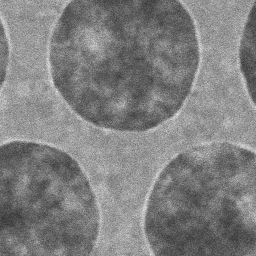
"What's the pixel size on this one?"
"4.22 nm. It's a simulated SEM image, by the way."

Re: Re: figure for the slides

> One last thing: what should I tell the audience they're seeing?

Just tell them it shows holes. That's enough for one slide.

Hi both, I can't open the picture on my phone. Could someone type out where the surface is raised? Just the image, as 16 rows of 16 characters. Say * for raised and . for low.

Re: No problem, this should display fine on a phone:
****........****
****........***.
.**.........***.
.**..........**.
***.........***.
***.........***.
****.......*****
*****......*****
****************
....*******.....
.....*****......
......****......
......***.......
......***.......
......***.......
......***.......